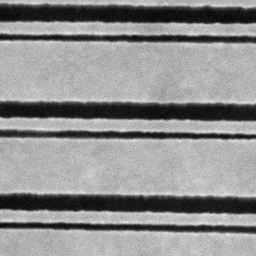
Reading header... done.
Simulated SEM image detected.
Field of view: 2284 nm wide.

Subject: lines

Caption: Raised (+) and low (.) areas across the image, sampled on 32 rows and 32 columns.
...++.++++++++++++++++++++++++++
................................
................................
++++++++++++++++++++++++++++++++
++++++++++++++++++++++++++++++++
++++++++++++++++++++++++++++++++
++++++++++++++++++++++++++++++++
++++++++++++++++++++++++++++++++
++++++++++++++++++++++++++++++++
++++++++++++++++++++++++++++++++
++++++++++++++++++++++++++++++++
++++++++++++++++++++++++++++++++
++++++++++++++++++++++++++++++++
................................
................................
++++++++++++++++++++++++++++++++
++++++++++++++++++++++++++++++++
++++++++++++++++++++++++++++++++
++++++++++++++++++++++++++++++++
++++++++++++++++++++++++++++++++
++++++++++++++++++++++++++++++++
++++++++++++++++++++++++++++++++
++++++++++++++++++++++++++++++++
++++++++++++++++++++++++++++++++
...........................+.+++
................................
++++++....+.....................
++++++++++++++++++++++++++++++++
++++++++++++++++++++++++++++++++
++++++++++++++++++++++++++++++++
++++++++++++++++++++++++++++++++
++++++++++++++++++++++++++++++++